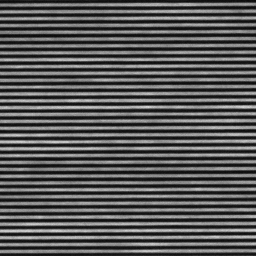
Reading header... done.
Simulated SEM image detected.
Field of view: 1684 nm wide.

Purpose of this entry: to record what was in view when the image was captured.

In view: parallel lines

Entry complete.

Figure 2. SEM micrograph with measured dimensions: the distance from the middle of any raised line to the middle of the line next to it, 45 nm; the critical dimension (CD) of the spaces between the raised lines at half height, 0.0271 microns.